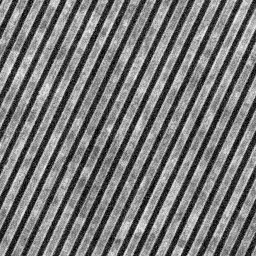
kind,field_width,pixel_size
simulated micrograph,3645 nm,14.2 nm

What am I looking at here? parallel lines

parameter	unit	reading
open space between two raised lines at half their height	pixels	7.58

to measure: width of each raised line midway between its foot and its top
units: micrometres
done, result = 0.108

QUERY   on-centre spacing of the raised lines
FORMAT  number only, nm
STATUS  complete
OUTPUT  207